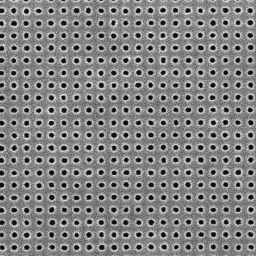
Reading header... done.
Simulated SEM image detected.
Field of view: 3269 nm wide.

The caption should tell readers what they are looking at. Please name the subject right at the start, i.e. a regular array of holes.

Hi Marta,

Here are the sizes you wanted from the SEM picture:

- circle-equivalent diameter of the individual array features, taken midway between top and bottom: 70.6 nanometres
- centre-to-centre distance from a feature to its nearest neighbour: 12.1 pixels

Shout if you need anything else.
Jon